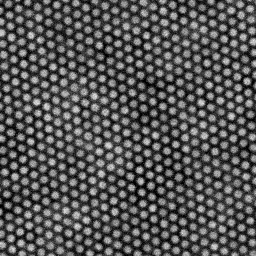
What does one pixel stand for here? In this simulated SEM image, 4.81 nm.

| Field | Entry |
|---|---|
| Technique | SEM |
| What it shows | a regular array of raised bodies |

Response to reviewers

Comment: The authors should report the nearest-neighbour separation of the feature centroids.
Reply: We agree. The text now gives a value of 0.0522 µm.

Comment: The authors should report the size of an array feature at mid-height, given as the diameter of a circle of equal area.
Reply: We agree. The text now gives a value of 32.1 nm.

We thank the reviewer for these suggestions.